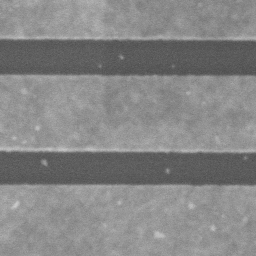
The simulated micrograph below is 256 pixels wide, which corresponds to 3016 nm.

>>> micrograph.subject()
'lines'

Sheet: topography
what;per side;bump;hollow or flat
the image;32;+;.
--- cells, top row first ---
++++++++++++++++++++++++++++++++
++++++++++++++++++++++++++++++++
++++++++++++++++++++++++++++++++
++++++++++++++++++++++++++++++++
++++++++++++++++++++++++++++++++
................................
................................
................................
................................
+++++++++++++.+.+..+.+..+.......
++++++++++++++++++++++++++++++++
++++++++++++++++++++++++++++++++
++++++++++++++++++++++++++++++++
++++++++++++++++++++++++++++++++
++++++++++++++++++++++++++++++++
++++++++++++++++++++++++++++++++
++++++++++++++++++++++++++++++++
++++++++++++++++++++++++++++++++
++++++++++++++++++++++++++++++++
................................
................................
................................
................................
++++++++++++++++++++++++++++++++
++++++++++++++++++++++++++++++++
++++++++++++++++++++++++++++++++
++++++++++++++++++++++++++++++++
++++++++++++++++++++++++++++++++
++++++++++++++++++++++++++++++++
++++++++++++++++++++++++++++++++
++++++++++++++++++++++++++++++++
++++++++++++++++++++++++++++++++